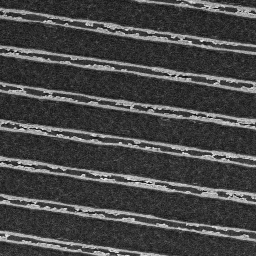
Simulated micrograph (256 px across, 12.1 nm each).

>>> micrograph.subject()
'parallel lines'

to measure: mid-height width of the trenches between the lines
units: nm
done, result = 347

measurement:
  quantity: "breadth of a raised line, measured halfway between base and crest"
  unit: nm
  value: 92.6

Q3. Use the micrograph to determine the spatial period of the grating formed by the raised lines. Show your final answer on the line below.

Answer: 445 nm